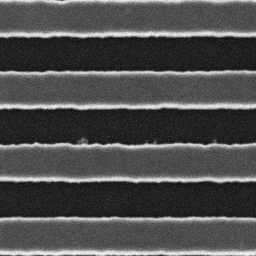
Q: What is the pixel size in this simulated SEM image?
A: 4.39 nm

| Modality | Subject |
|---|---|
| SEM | lines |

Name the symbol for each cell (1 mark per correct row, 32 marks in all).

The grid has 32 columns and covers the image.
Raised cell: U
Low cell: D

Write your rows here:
UUUUUUUUUUUUUUUUUUUUUUUUUUUUUUUU
UUUUUUUUUUUUUUUUUUUUUUUUUUUUUUUU
UUUUUUUUUUUUUUUUUUUUUUUUUUUUUUUU
UUUUUUUUUUUUUUUUUUUUUUUUUUUUUUUU
UUDUUUUDDUUUUDDDDDDDDDUUDDDDDDUD
DDDDDDDDDDDDDDDDDDDDDDDDDDDDDDDD
DDDDDDDDDDDDDDDDDDDDDDDDDDDDDDDD
DDDDDDDDDDDDDDDDDDDDDDDDDDDDDDDD
DDDDDDDDDDDDDDDDDDDDDDDDDDDDDDDD
UUUUUUUUUUUUUUUUUUUUUUUUUUUUUUUU
UUUUUUUUUUUUUUUUUUUUUUUUUUUUUUUU
UUUUUUUUUUUUUUUUUUUUUUUUUUUUUUUU
UUUUUUUUUUUUUUUUUUUUUUUUUUUUUUUU
DDUUUUUDDUUUUDDDUUDUDDUUUUDDDDUD
DDDDDDDDDDDDDDDDDDDDDDDDDDDDDDDD
DDDDDDDDDDDDDDDDDDDDDDDDDDDDDDDD
DDDDDDDDDDDDDDDDDDDDDDDDDDDDDDDD
DDDDDDDDDDDDDDDDDDDDDDDDDDDDDDDD
UUUUUUUUUUUUUUUUUUUUUUUUUUUUUUUU
UUUUUUUUUUUUUUUUUUUUUUUUUUUUUUUU
UUUUUUUUUUUUUUUUUUUUUUUUUUUUUUUU
UUUUUUUUUUUUUUUUUUUUUUUUUUUUUUUU
UUUUUUUUUUUUUUUUUUUUUUUUUUUUUUUU
DDDDDDDDDDDDDDDDDDDDDDDDDDDDDDDD
DDDDDDDDDDDDDDDDDDDDDDDDDDDDDDDD
DDDDDDDDDDDDDDDDDDDDDDDDDDDDDDDD
DDDDDDDDDDDDDDDDDDDDDDDDDDDDDDDD
UUUUUUUUUUUUUUUUUUUUUUUUUUUUUUUU
UUUUUUUUUUUUUUUUUUUUUUUUUUUUUUUU
UUUUUUUUUUUUUUUUUUUUUUUUUUUUUUUU
UUUUUUUUUUUUUUUUUUUUUUUUUUUUUUUU
UUUUUUUUUUUUUUUUUUUUUUUUUUUUUUUU